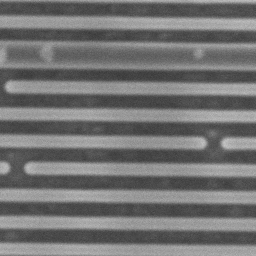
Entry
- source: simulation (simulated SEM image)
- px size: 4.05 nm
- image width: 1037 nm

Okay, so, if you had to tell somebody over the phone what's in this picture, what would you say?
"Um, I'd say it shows groups of lines, slits or small figures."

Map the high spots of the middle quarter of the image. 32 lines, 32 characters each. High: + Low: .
++++++++++++++++++++++++++++++++
................................
................................
................................
+++++++.........................
++++++++++++++++++++++++++++++++
++++++++++++++++++++++++++++++++
................................
................................
................................
................................
++++++++++++++++++++++++++......
++++++++++++++++++++++++++++++++
++++++++++++++++++++++++++++++++
................................
................................
................................
................................
++++++++++++++++++++++++++++++++
++++++++++++++++++++++++++++++++
++++++++++++++++++++++++++++++++
................................
................................
................................
................................
++++++++++++++++++++++++++++++++
++++++++++++++++++++++++++++++++
..........++++++++++++++++++++++
................................
................................
................................
................................